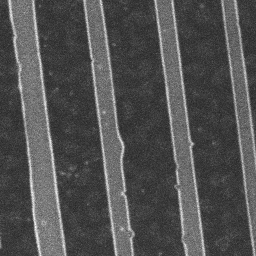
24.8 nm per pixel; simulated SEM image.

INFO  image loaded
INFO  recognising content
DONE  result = one or a few lines or trenches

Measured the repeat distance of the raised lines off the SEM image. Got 68.9 px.